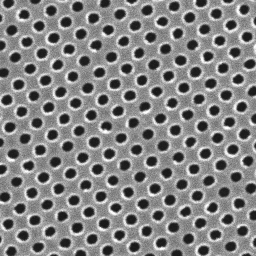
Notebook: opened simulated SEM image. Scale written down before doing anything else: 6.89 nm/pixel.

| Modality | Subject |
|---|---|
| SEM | a regular array of holes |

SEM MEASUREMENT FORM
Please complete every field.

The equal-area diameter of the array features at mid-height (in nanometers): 72.6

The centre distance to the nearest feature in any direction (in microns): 0.13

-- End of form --